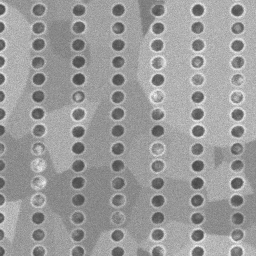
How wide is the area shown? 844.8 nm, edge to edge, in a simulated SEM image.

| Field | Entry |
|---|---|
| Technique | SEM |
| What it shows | a regular array of holes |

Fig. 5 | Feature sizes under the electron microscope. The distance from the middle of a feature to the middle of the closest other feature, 0.0562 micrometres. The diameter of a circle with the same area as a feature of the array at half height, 0.0418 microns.